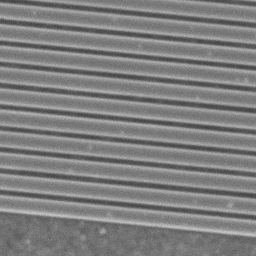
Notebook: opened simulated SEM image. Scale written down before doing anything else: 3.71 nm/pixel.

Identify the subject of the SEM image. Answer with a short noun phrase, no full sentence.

parallel lines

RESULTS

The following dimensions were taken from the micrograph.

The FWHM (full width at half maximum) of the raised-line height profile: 15.5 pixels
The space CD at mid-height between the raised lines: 21.7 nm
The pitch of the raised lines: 78.8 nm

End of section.